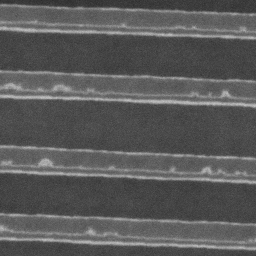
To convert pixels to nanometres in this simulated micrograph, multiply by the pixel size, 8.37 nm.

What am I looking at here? lines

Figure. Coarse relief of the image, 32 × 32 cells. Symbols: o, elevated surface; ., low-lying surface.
................................
ooooooooooooooooooooooo.........
oooooooooooooooooooooooooooooooo
oooooooooooooooooooooooooooooooo
...........................ooooo
................................
................................
................................
................................
oooooooooooooooo................
oooooooooooooooooooooooooooooooo
oooooooooooooooooooooooooooooooo
...............ooooooooooooooooo
................................
................................
................................
................................
................................
ooo.............................
oooooooooooooooooooooooo........
oooooooooooooooooooooooooooooooo
...ooooooooooooooooooooooooooooo
..........................oooooo
................................
................................
................................
................................
ooooooooooooooooo...............
oooooooooooooooooooooooooooooooo
oooooooooooooooooooooooooooooooo
.....................ooooooooooo
................................